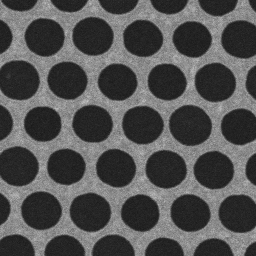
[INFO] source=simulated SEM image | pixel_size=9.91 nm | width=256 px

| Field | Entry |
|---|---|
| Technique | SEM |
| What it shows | a regular array of holes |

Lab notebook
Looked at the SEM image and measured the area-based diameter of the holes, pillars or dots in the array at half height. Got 394 nanometers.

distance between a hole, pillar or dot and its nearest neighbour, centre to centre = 484 nm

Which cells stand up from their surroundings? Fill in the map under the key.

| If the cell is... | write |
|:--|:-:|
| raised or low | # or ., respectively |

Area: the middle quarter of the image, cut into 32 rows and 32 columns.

....#######.....#######.....####
.....####........#####.......###
......###.........###.........##
......##..........###..........#
......##..........###..........#
......##..........###..........#
.....####.........###.........##
.....#####.......#####........##
...########.....#######.....####
################################
#####...##########..#########...
###........#####.......#####....
###........####.........###.....
##..........###..........#......
##..........##...........#......
##..........##...........#......
##..........###..........#......
###.........###.........###.....
####.......#####........###.....
#####....########.....######....
###############################.
..#########...##########..######
....#####.......######.......###
.....####........####.........##
.....###..........###.........##
......##..........##...........#
.....###..........##...........#
.....###..........##...........#
.....####........####.........##
...#######.......#####........##
###########.....#######.....####
################################